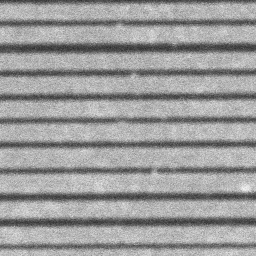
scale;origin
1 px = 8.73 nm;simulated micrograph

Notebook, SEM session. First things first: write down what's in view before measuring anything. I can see parallel lines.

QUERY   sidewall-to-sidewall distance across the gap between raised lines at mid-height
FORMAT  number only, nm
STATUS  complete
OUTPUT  66.6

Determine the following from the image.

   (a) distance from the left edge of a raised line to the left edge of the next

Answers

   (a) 216 nm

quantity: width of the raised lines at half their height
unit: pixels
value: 16.3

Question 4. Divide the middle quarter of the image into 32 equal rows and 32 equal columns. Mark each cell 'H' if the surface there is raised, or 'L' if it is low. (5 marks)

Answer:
HHHHHHHHHHHHHHHHHHHHHHHHHHHHHHHH
LLLLLLLLLLLLLLLLLLLLLLLLLLLLLLLL
LLLLLLLLLLLLLLLLLLLLLLLLLLLLLLLL
HHHHHHHHHHHHHHHHHHHHHHHHHHHHHHHH
HHHHHHHHHHHHHHHHHHHHHHHHHHHHHHHH
HHHHHHHHHHHHHHHHHHHHHHHHHHHHHHHH
HHHHHHHHHHHHHHHHHHHHHHHHHHHHHHHH
LLLLLLLLLLLLLLLLLLLLLLLLLLLLLLLL
LLLLLLLLLLLLLLLLLLLLLLLLLLLLLLLL
LLLLLLLLLLLLLLLLLHHHHHHHHHHHHHHH
HHHHHHHHHHHHHHHHHHHHHHHHHHHHHHHH
HHHHHHHHHHHHHHHHHHHHHHHHHHHHHHHH
HHHHHHHHHHHHHHHHHHHHHHHHHHHHHHHH
LLLLLLLLLLLLLLLLLLLLLLLLLLLLLLLL
LLLLLLLLLLLLLLLLLLLLLLLLLLLLLLLL
HHHHHHHHHHHHHHHHHHHHHHHHHHHHHHHH
HHHHHHHHHHHHHHHHHHHHHHHHHHHHHHHH
HHHHHHHHHHHHHHHHHHHHHHHHHHHHHHHH
HHHHHHHHHHHHHHHHHHHHHHHHHHHHHHHH
LLLLLLLLLLLLLLLLLLLLLLLLLLLLLLLL
LLLLLLLLLLLLLLLLLLLLLLLLLLLLLLLL
HHHHHHHHHHHHHHHHHHHHHHHHHHHHHHHH
HHHHHHHHHHHHHHHHHHHHHHHHHHHHHHHH
HHHHHHHHHHHHHHHHHHHHHHHHHHHHHHHH
HHHHHHHHHHHHHHHHHHHHHHHHHHHHHHHH
HHHHHHHHHHHHHHHHHHHHHHHHHHHHHHHH
LLLLLLLLLLLLLLLLLLLLLLLLLLLLLLLL
LLLLLLLLLLLLLLLLLLLLLLHLLLLLLLLL
HHHHHHHHHHHHHHHHHHHHHHHHHHHHHHHH
HHHHHHHHHHHHHHHHHHHHHHHHHHHHHHHH
HHHHHHHHHHHHHHHHHHHHHHHHHHHHHHHH
HHHHHHHHHHHHHHHHHHHHHHHHHHHHHHHH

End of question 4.